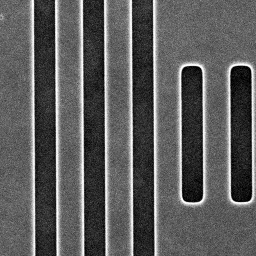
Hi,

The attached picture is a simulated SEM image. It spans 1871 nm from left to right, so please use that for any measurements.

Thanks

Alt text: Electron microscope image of groups of lines, slits or small figures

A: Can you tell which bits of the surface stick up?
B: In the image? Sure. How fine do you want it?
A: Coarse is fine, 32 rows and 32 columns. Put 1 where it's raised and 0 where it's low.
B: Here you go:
11110001110001110001111111111111
11110001110001110001111111111111
11110001110001110001111111111111
11110001110001110001111111111111
11110001110001110001111111111111
11110001110001110001111111111111
11110001110001110001111111111111
11110001110001110001111111111111
11110001110001110001111001111001
11110001110001110001111001111001
11110001110001110001111001111000
11110001110001110001111001111000
11110001110001110001111001111000
11110001110001111001111001111000
11110001110001111001111001111000
11110001110001111001111001111000
11110001110001111001111001111000
11110001110001111001111001111000
11110001110001111001111001111000
11110001110001111001111001111000
11110001110001111001111001111000
11110001110001111001111001111000
11110001110001111001111001111000
11110001110001111001111001111000
11110001110001111001111001111001
11110001110001111001111111111111
11110001110001111001111111111111
11110001110001111001111111111111
11110001110001111001111111111111
11110001110001111001111111111111
11110001110001111001111111111111
11110001110001111001111111111111